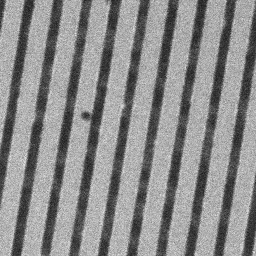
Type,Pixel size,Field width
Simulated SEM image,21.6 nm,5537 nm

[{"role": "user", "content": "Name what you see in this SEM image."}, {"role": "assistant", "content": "parallel lines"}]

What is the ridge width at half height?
0.272 µm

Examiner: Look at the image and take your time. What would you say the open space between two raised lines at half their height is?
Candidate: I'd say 339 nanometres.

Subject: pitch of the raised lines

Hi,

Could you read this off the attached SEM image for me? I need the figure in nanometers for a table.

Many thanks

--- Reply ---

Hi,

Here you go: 616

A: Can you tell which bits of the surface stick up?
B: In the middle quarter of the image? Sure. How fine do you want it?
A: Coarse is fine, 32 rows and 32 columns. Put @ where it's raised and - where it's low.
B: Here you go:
--@@@----@@@----@@@----@@@----@@
-@@@-----@@@----@@@----@@@----@@
-@@@----@@@@----@@@----@@@----@@
-@@@----@@@-----@@@----@@@----@@
-@@@----@@@----@@@-----@@@----@@
-@@@----@@@----@@@----@@@@----@-
-@@@----@@@----@@@----@@@----@@-
@@@-----@@@----@@@----@@@----@@@
@@@----@@@@----@@@----@@@----@@-
@@@----@@@------@@----@@@----@@@
@@@----@@@-------@----@@@----@@@
@@@----@@@----@@@----@@@@----@@@
@@@----@@@----@@@----@@@----@@@@
@@-----@@@----@@@----@@@----@@@-
@@----@@@@----@@@----@@@----@@@-
@@----@@@-----@@@----@@@----@@@-
@@----@@@----@@@-----@@@----@@@-
@@----@@@----@@-----@@@@----@@@-
@@----@@@----@@@----@@@----@@@@-
@-----@@@----@@@----@@@----@@@--
@----@@@@----@@@----@@@----@@@--
@----@@@-----@@@----@@@----@@@--
@----@@@----@@@-----@@@----@@@--
@----@@@----@@@----@@@@----@@@--
@----@@@----@@@----@@@----@@@@--
-----@@@----@@@----@@@----@@@---
----@@@@----@@@----@@@----@@@---
----@@@-----@@@----@@@----@@@---
----@@@----@@@-----@@@----@@@---
----@@@----@@@----@@@@----@@@---
----@@@----@@@----@@@----@@@@---
----@@@----@@@----@@@----@@@----